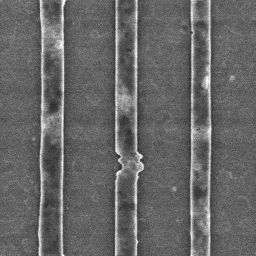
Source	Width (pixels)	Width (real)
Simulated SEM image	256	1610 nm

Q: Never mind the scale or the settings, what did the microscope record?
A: one or a few lines or trenches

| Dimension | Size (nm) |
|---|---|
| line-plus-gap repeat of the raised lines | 467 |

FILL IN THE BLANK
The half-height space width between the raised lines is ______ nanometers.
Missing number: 335